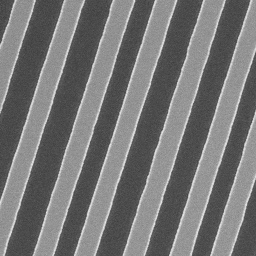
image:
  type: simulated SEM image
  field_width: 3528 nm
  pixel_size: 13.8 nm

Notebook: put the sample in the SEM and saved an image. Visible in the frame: lines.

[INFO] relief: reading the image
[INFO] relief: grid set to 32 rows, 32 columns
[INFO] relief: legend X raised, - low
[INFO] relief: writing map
--XX----XX----XXX--XXX---XXX---X
-XXX----XX----XX---XXX---XXX---X
-XXX---XXX---XXX---XX----XX----X
-XX----XXX---XXX--XXX---XXX---XX
XXX----XX----XX---XXX---XXX---XX
XXX---XXX---XXX---XX----XX----XX
XX----XXX---XXX--XXX---XXX---XXX
XX----XX----XX---XXX---XXX---XXX
XX---XXX---XXX---XX----XX----XX-
X----XXX---XXX--XXX----XX---XXX-
X----XX----XXX--XXX---XXX---XXX-
X---XXX----XX---XX----XXX---XX--
X---XXX---XXX---XX---XXX---XXX--
----XX----XXX--XXX---XXX---XXX--
---XXX----XX---XX----XXX---XX---
---XXX---XXX---XX----XX---XXX--X
---XX----XXX--XXX---XXX---XXX--X
---XX----XX---XXX---XXX---XX---X
--XXX---XXX---XX----XX---XXX--XX
--XX----XXX--XXX---XXX---XXX--XX
--XX----XX---XXX---XXX---XXX--XX
-XXX---XXX---XX----XX---XXX---XX
-XXX---XXX--XXX---XXX---XXX--XXX
-XX----XX---XXX---XXX---XXX--XXX
XXX---XXX---XX----XX----XX---XX-
XXX---XXX--XXX---XXX---XXX--XXX-
XX----XX---XXX---XXX---XXX--XXX-
XX----XX---XX----XX----XX---XX--
XX---XXX--XXX---XXX---XXX--XXX--
X----XX---XXX---XXX---XXX--XXX--
X----XX---XX----XXX---XX---XX---
X---XXX--XXX----XX---XXX--XXX---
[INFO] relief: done